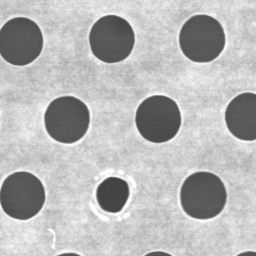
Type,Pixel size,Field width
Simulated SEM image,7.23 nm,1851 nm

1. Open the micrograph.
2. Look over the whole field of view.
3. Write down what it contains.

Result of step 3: holes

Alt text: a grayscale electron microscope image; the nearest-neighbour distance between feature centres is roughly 88.6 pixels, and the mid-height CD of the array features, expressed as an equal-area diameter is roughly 337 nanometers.